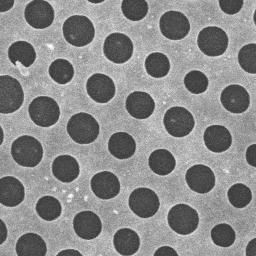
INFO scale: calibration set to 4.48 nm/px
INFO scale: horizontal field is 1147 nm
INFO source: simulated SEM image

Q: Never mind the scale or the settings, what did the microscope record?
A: a regular array of holes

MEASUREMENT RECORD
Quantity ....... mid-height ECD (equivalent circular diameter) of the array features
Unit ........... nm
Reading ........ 133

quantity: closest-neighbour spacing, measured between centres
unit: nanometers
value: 190